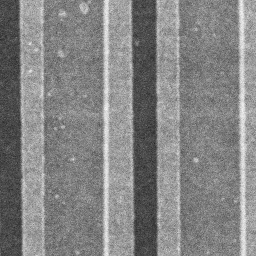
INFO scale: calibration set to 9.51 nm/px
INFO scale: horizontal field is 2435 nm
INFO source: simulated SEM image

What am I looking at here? lines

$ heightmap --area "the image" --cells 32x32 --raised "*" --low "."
...**........***....**........**
...**........***....**........**
...**........***....**........**
...**........***....**........**
...**........***....**........**
...**........***....**........**
...**.........**....**........**
...**........***....**........**
...**........***....**........**
...**........***....**........**
...**........***....**........**
...**........***....**........**
...**........***....**........**
...**........***....**........**
...**........***....**........**
...**........***....**........**
...**........****...**........**
...**........****...**........**
...**........***....**........**
...**........****...**........**
...**........****...**........**
...**........****...**........**
...**........****...**........**
...**........****...**........**
...**........****...**........**
...**........****...**........**
...**........****...**........**
...**........****...**.........*
...**........****...**........**
...**........****...**.........*
...**........****...**.........*
...**........****...**.........*